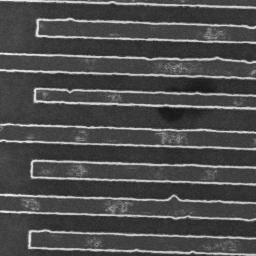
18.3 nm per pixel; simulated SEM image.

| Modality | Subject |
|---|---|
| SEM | parallel lines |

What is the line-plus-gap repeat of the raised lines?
35.3 pixels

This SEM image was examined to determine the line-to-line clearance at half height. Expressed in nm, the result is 336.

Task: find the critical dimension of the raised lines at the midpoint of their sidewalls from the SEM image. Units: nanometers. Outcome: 302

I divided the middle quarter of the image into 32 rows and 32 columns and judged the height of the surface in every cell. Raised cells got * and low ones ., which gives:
********************************
********************************
...............*****************
................................
................................
................................
...*............................
****************************.**.
********************************
********************************
...............................*
................................
................................
................................
................................
................................
**********************....*.....
********************************
********************************
********************************
.........................*******
................................
................................
................................
.****...........................
********************************
********************************
********************************
*.******************************
................................
................................
................................